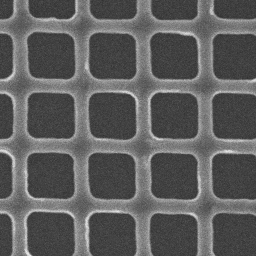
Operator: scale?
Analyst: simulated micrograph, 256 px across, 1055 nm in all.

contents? a regular array of holes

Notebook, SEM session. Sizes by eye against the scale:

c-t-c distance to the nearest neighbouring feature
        0.246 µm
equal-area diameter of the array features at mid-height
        212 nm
